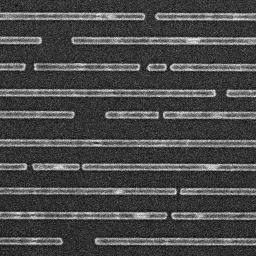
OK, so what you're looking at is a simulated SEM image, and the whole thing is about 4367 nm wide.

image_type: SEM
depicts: parallel lines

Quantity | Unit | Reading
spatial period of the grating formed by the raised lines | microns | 0.426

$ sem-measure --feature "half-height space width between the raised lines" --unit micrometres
0.311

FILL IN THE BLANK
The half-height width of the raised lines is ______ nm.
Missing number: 107